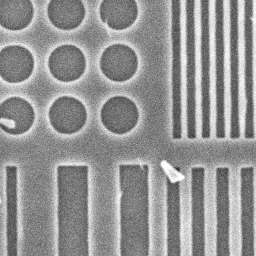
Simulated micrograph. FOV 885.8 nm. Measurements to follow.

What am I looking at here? groups of lines, slits or small figures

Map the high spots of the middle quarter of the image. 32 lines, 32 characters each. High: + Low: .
......+++..........++++++++..+..
.....++++.........+++++++++.....
.....+++++........+++++++++..+..
....+++++++......++++++++++..+..
..+++++++++++..++++++++++++..+..
+++++++++++++++++++++++++++..+..
+++++++++++++++++++++++++++..++.
+++++++++++++++++++++++++++..++.
...++++++++.....+++++++++++...+.
....++++++.......++++++++++.....
.....+++++........+++++++++.....
......+++..........++++++++...+.
......+++..........++++++++...+.
......+++..........++++++++..++.
......+++.........+++++++++..++.
.....+++++........+++++++++...+.
....+++++++......++++++++++...+.
..+++++++++++..++++++++++++...+.
+++++++++++++++++++++++++++..++.
++++++++++++++++++++++++++++++++
++++++++++++++++++++++++++++++++
++++++++++++++++++++++++++++++++
++++++++++++++++++++++++++++++++
++++++++++++++++++++++++++++++++
++++++++++++++++++++++++++++++++
......++++++++.....+.+++++++++++
......++++++++.......+++++++.+++
......++++++++.......+++++++++++
......++++++++.......++++.++++++
......++++++++.......++++..+.+++
......++++++++.......++++....+++
......++++++++.......++++....+++